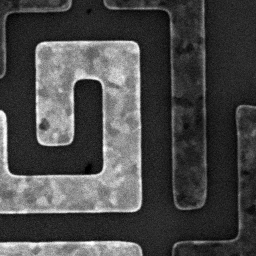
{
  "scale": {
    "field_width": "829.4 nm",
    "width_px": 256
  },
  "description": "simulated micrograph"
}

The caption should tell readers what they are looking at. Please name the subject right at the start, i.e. wiring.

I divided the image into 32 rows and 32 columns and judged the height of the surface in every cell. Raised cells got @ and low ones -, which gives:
@@@@@@@@@----@@@@@@@@@@@@-------
@@@------------------@@@@-------
@--------------------@@@@-------
@--------------------@@@@@------
@--------------------@@@@@------
@----@@@@@@@@@@@@----@@@@@------
@----@@@@@@@@@@@@----@@@@@------
@----@@@@@@@@@@@@----@@@@@------
@----@@@@@@@@@@@@-----@@@@------
-----@@@@@@@@@@@@-----@@@@------
-----@@@@----@@@@-----@@@@------
-----@@@@----@@@@-----@@@@------
-----@@@@----@@@@-----@@@@------
-----@@@@----@@@@-----@@@@----@@
@----@@@@----@@@@-----@@@@----@@
@----@@@@----@@@@-----@@@@----@@
@----@@@@----@@@@-----@@@@----@@
@----@@@@----@@@@-----@@@@----@@
@------------@@@@-----@@@@----@@
@------------@@@@-----@@@@----@@
@------------@@@@-----@@@@----@@
@------------@@@@-----@@@@----@@
@@@@@@@@@@@@@@@@@@----@@@@----@@
@@@@@@@@@@@@@@@@@@----@@@@----@@
@@@@@@@@@@@@@@@@@@----@@@@----@@
@@@@@@@@@@@@@@@@@@----@@@-----@@
@@@@@@@@@---------------------@@
------------------------------@@
------------------------------@@
------------------------------@@
@@@@@@@@@@@@@@@@@-----@@@@@@@@@@
@@@@@@@@@@@@@@@@@@----@@@@@@@@@@